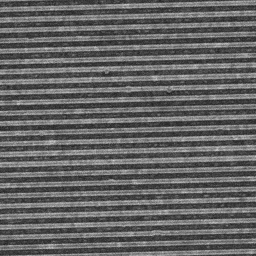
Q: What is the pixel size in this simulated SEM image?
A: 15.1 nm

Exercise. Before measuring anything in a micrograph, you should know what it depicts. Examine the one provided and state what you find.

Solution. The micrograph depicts parallel lines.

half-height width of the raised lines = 2.87 px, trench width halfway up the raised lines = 111 nm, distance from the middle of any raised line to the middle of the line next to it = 156 nm